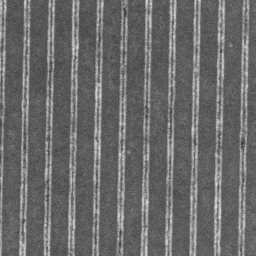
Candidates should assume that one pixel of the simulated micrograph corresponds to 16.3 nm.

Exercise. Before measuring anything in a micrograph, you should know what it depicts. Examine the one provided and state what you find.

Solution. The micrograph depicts parallel lines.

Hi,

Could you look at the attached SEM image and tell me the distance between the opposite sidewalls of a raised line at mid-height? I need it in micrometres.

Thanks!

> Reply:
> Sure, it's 0.0896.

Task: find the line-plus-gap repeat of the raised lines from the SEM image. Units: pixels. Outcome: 24.3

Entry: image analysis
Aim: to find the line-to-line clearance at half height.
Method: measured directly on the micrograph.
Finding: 312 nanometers